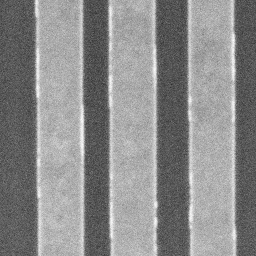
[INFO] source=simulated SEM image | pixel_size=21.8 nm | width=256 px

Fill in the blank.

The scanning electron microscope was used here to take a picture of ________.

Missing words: lines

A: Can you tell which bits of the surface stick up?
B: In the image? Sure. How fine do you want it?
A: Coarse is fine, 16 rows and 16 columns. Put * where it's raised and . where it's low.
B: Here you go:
..***..***..***.
..***..***..***.
..***..***..***.
..***..***..***.
..***..***..***.
..***..***..***.
..***..***..***.
..***..***..***.
..***..***..***.
..***..***..***.
..***..***..***.
..***..***..***.
..***..***..***.
..***..***..***.
..***..***..***.
..***..***..***.